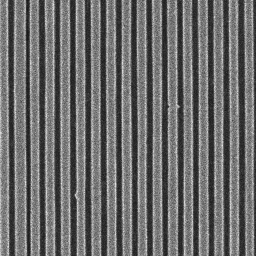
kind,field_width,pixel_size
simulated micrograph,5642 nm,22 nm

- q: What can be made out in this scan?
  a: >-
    parallel lines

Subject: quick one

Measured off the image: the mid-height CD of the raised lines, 207 nm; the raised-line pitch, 0.337 micrometres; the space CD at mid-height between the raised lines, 143 nm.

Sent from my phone